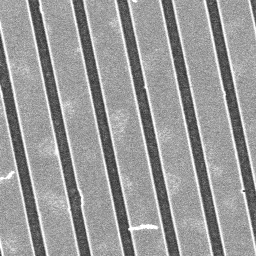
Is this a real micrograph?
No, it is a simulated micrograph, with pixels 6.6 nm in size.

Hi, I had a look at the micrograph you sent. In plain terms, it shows parallel lines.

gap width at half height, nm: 76.9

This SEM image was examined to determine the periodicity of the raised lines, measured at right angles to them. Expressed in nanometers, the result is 288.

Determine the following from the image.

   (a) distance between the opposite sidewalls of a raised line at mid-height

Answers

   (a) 210 nanometres